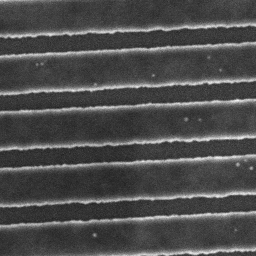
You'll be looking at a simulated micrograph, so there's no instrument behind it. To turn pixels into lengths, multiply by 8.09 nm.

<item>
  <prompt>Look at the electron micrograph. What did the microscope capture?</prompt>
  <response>lines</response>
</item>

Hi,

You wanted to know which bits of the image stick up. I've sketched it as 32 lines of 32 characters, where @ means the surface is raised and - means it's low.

@@@@@@@@@@@@@@@@@@@@@@@@@@@@@@@@
@@@@@@@@@@@@@@@@@@@@@@@@@@@@@@@@
@@@@@@@@@@@@@@@@@@@@@@@@@@@@@@@@
@@@@@@@@@@@@@@@@@@@@@@@@@@------
@@@@@---------------------------
---------------------------@@@@@
----------@@@@@@@@@@@@@@@@@@@@@@
@@@@@@@@@@@@@@@@@@@@@@@@@@@@@@@@
@@@@@@@@@@@@@@@@@@@@@@@@@@@@@@@@
@@@@@@@@@@@@@@@@@@@@@@@@@@@@@@@@
@@@@@@@@@@@@@@@@@@@@@@@@@-------
@@@@@@--------------------------
------------------------------@@
--------@@@@@@@@@@@@@@@@@@@@@@@@
@@@@@@@@@@@@@@@@@@@@@@@@@@@@@@@@
@@@@@@@@@@@@@@@@@@@@@@@@@@@@@@@@
@@@@@@@@@@@@@@@@@@@@@@@@@@@@@@@@
@@@@@@@@@@@@@@@@@@@@@@@@@@------
@@@@----------------------------
------------------------------@@
-----------@@@@@@@@@@@@@@@@@@@@@
@@@@@@@@@@@@@@@@@@@@@@@@@@@@@@@@
@@@@@@@@@@@@@@@@@@@@@@@@@@@@@@@@
@@@@@@@@@@@@@@@@@@@@@@@@@@@@@@@@
@@@@@@@@@@@@@@@@@@@@@@@@@@@@----
@@@@@@@-------------------------
-------------------------------@
--------------@@@@@@@@@@@@@@@@@@
@@@@@@@@@@@@@@@@@@@@@@@@@@@@@@@@
@@@@@@@@@@@@@@@@@@@@@@@@@@@@@@@@
@@@@@@@@@@@@@@@@@@@@@@@@@@@@@@@@
@@@@@@@@@@@@@@@@@@@@@@@@@@@-----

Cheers